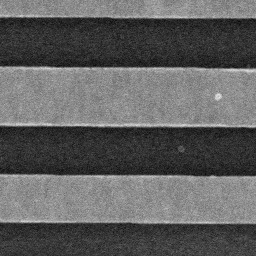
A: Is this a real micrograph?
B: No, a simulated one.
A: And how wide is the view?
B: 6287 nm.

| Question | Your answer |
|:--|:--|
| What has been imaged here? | lines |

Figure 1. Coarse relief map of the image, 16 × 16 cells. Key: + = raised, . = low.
++++++++++++++++
................
................
................
++++++++++++++++
++++++++++++++++
++++++++++++++++
++++++++++++++++
................
................
................
++++++++++++++++
++++++++++++++++
++++++++++++++++
................
................